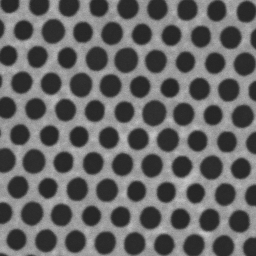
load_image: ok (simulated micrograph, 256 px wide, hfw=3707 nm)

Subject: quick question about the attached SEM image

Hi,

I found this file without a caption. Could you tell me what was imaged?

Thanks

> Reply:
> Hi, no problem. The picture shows a regular array of holes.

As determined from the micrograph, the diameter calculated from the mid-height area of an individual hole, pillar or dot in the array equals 316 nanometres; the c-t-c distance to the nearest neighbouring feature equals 0.427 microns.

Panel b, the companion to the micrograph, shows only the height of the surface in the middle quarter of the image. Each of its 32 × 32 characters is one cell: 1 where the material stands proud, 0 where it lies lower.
00011100001110000011100001110000
11111110011111000011100001111000
11100011111111111111111111111111
11000001100000111100011111111111
10000001100000111000011100001111
10000001100000110000001100000110
11000001100000110000001100000110
11000011110000111000011100001110
11111111111011111100111111011111
00111100011111001111100011111111
00011000001110000111000001110000
00011000001100000011000000100000
00011000001110000010000000100000
00111100001110000111000001100000
11111110111111001111000001110000
11101111111111111111100111111011
11000011100001111000111110011111
10000011100000110000011100001110
10000011100000110000011000000110
11000011100000110000011000000110
11100111100001110000011000001110
11111111111111111101111100011111
00111100011111001111110111111111
00111000001110000111000011110001
00111000001100000110000001100000
00111000001100000110000001100000
00111000011100000110000011100000
11111100111110001111000011100001
11101111111111111111101111111011
10000011100001111000111110111111
10000011000001110000111100001110
10000011000000110000011000001110